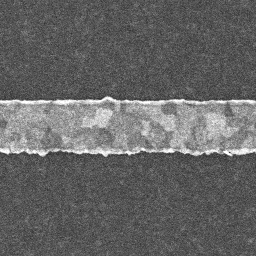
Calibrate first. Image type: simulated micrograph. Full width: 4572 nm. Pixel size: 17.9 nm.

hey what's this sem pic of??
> one or a few lines or trenches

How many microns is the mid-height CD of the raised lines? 0.915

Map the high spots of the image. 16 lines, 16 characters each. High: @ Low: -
----------------
----------------
----------------
----------------
----------------
----------------
@@@@@@@@@@@@@@@@
@@@@@@@@@@@@@@@@
@@@@@@@@@@@@@@@@
@-@-@@@@@--@@@@@
----------------
----------------
----------------
----------------
----------------
----------------